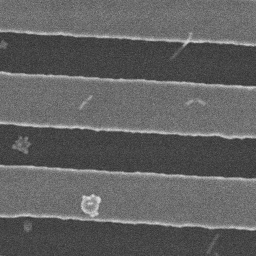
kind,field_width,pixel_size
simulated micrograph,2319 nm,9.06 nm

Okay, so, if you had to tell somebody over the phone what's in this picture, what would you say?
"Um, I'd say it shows lines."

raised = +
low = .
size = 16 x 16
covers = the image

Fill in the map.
++++++++++++++++
++++++++++++++++
.........+++++++
................
................
++++++++++++++++
++++++++++++++++
++++++++++++++++
..............++
................
+++.............
++++++++++++++++
++++++++++++++++
++++++++++++++++
................
................